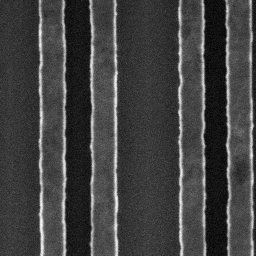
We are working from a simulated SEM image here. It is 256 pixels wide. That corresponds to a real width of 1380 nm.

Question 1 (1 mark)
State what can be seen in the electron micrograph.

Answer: lines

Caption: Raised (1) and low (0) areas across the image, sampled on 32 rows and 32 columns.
00000111000111100000000110001110
00000111000111100000001110001110
00000111000111000000001111001110
00000111000111000000001110001110
00000111000111000000001110001110
00000111000111100000000110001110
00000111000111100000001110001110
00000111000111100000001110001110
00000111000111100000001110001110
00000111000111100000000110001110
00000111000111100000000111001110
00000111000111100000001111001110
00000111000111100000001111001110
00000111000011100000001111001110
00000111000111100000001110001110
00000111000111100000000111001111
00000111000111100000000110000110
00000111000111100000001110001110
00000111000111100000000111001110
00000111000111100000000111000110
00000111000011100000000111000110
00000111000011100000000111001111
00000111000111100000000111001111
00000111000111100000000111000110
00000111000111100000000111000110
00000111000111100000000111001111
00000111000111100000000111001111
00000111000111100000000111001111
00000111000111100000000111000111
00000111000111100000000111000110
00000111000111100000000111001111
00000111000111100000000111000111